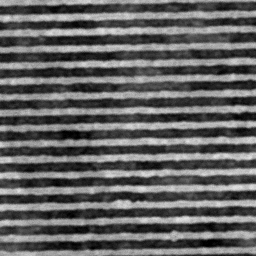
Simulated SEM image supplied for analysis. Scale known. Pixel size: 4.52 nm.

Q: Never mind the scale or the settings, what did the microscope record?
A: parallel lines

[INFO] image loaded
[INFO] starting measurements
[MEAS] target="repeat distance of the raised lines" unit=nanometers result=71.2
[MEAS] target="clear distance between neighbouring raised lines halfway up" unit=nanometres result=48.6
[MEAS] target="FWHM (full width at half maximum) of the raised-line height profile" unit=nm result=24.3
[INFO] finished